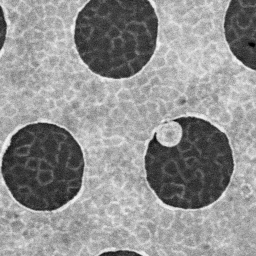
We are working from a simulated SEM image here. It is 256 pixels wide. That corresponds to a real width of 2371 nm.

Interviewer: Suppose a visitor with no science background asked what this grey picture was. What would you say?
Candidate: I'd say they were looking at holes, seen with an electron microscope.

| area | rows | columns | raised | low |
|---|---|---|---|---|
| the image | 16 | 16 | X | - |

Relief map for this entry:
XXXXX-----XXXX--
XXXXX-----XXXX--
XXXXX-----XXXX--
XXXXX-----XXXXX-
XXXXXX---XXXXXXX
XXXXXXXXXXXXXXXX
XXXXXXXXXXXXXXXX
XXXXXXXXXXX--XXX
X----XXXXXX---XX
-----XXXX------X
-----XXXX------X
-----XXXX-----XX
X---XXXXXX----XX
XXXXXXXXXXXXXXXX
XXXXXXXXXXXXXXXX
XXXXXXXXXXXXXXXX